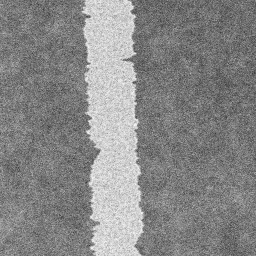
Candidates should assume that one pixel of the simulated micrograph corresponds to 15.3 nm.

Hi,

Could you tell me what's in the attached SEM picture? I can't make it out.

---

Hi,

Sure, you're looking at one or a few lines or trenches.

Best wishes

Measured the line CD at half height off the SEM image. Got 678 nanometres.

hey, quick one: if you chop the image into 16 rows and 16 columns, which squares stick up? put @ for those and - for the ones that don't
-----@@@--------
-----@@@--------
-----@@@--------
------@@--------
-----@@@--------
------@@--------
------@@--------
------@@--------
------@@--------
------@@--------
------@@@-------
------@@@-------
------@@@-------
------@@@-------
------@@@-------
------@@--------